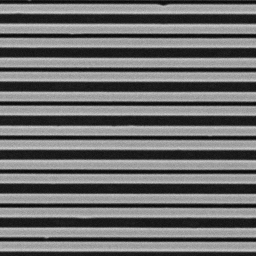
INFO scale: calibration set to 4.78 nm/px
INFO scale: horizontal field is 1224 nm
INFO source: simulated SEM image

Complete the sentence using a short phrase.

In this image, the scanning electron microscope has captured parallel lines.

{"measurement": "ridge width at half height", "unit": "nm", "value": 46.6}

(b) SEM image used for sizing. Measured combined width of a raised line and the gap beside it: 81 nanometers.